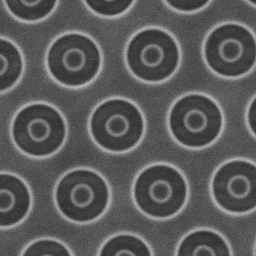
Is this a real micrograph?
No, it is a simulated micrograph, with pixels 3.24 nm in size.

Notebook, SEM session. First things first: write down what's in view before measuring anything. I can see an array of small figures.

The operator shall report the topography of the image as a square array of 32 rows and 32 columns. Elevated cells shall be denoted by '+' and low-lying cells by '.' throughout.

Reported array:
+..+...++++.....+++++.....++++++
+.....++++++...++++++++.++++++++
+++..+++++++++++++++++++++++++++
+++++++++++++++++++++++++++....+
++++++++...++++++....+++++......
..+++++.....++++......++++..++..
..++++...+..++++..++..++++..++..
+..+++..++...+++..++..++++..+...
+..+++...+..++++......++++......
...++++.....+++++....+++++++..++
..++++++...+++++++++++++++++++++
++++++++++++++++++++++++++++++++
++++++++++++++..++++++....++++++
+++....+++++.....++++......++++.
++......+++...+...+++..+++..+++.
++..++..+++..+++..+++..+++..+++.
++..++..+++...++..+++......+++++
++..+...++++.....+++++.....+++++
++.....++++++...++++++++++++++++
++++..++++++++++++++++++++++++++
++++++++++++++++++++++++++++....
+++++++++...++++++....+++++.....
...+++++.....++++......++++..++.
...++++..++...+++..++..+++...++.
++..+++..+++..+++..++..++++..+..
++..+++..++..++++......++++.....
...+++++.....+++++....+++++++..+
...++++++...++++++++++++++++++++
++++++++++++++++++++++++++++++++
++++++++++++++...++++++.....++++
++++....+++++.....+++++.....++++
+++......++++..+...+++..+++..+++